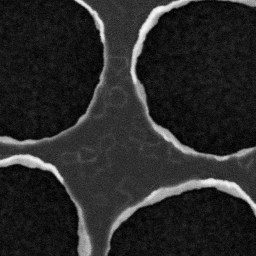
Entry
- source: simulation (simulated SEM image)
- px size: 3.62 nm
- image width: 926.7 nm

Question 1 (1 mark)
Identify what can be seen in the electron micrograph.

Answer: holes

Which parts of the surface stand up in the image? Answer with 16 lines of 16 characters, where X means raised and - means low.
-----XXXXXX-----
------XXXX------
------XXX-------
-------XX-------
------XX--------
------XXX-------
------XXX-------
-----XXXXX------
---XXXXXXXX-----
XXXXXXXXXXXX---X
--XXXXXXXXXXXXXX
----XXXXXXXXXXXX
-----XXXXX-----X
-----XXX--------
-----XX---------
-----XX---------